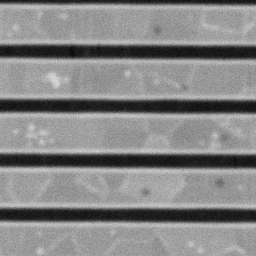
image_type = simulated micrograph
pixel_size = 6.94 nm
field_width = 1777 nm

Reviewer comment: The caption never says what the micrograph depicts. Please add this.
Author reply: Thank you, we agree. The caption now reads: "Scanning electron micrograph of wiring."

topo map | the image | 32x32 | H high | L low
LLLLLLLLLLLLLLLLLLLLLLLLLLLLLLLL
HHHHHHHHHHHHHHHHHHHHHHHHHHHHHHHH
HHHHHHHHHHHHHHHHHHHHHHHHHHHHHHHH
HHHHHHHHHHHHHHHHHHHHHHHHHHHHHHHH
HHHHHHHHHHHHHHHHHHHHHHHHHHHHHHHH
LLLLLLLLLLLLLLLLLLLLLLLLLLLLLLLL
LLLLLLLLLLLLLLLLLLLLLLLLLLLLLLLL
LLLLLLLLLLLLLLLLLLLLLLLLLLLLLLLL
HHHHHHHHHHHHHHHHHHHHHHHHHHHHHHHH
HHHHHHHHHHHHHHHHHHHHHHHHHHHHHHHH
HHHHHHHHHHHHHHHHHHHHHHHHHHHHHHHH
HHHHHHHHHHHHHHHHHHHHHHHHHHHHHHHH
LLLLLLLLLLLLLLLLLLLLLLLLLLLLLLLL
LLLLLLLLLLLLLLLLLLLLLLLLLLLLLLLL
HHHHHHHHHHHHHHHHHHHHHHHHHHHHHHHH
HHHHHHHHHHHHHHHHHHHHHHHHHHHHHHHH
HHHHHHHHHHHHHHHHHHHHHHHHHHHHHHHH
HHHHHHHHHHHHHHHHHHHHHHHHHHHHHHHH
HHHHHHHHHHHHHHHHHHHHHHHHHHHHHHHH
LLLLLLLLLLLLLLLLLLLLLLLLLLLLLLLL
LLLLLLLLLLLLLLLLLLLLLLLLLLLLLLLL
HHHHHHHHHHHHHHHHHHHHHHHHHHHHHHHH
HHHHHHHHHHHHHHHHHHHHHHHHHHHHHHHH
HHHHHHHHHHHHHHHHHHHHHHHHHHHHHHHH
HHHHHHHHHHHHHHHHHHHHHHHHHHHHHHHH
HHHHHHHHHHHHHHHHHHHHHHHHHHHHHHHH
LLLLLLLLLLLLLLLLLLLLLLLLLLLLLLLL
LLLLLLLLLLLLLLLLLLLLLLLLLLLLLLLL
HHHHHHHHHHHHHHHHHHHHHHHHHHHHHHHH
HHHHHHHHHHHHHHHHHHHHHHHHHHHHHHHH
HHHHHHHHHHHHHHHHHHHHHHHHHHHHHHHH
HHHHHHHHHHHHHHHHHHHHHHHHHHHHHHHH